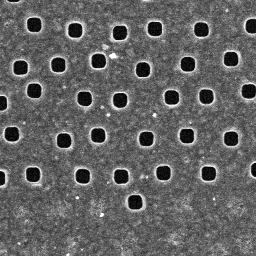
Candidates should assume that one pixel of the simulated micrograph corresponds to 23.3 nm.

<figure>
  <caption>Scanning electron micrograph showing a regular array of holes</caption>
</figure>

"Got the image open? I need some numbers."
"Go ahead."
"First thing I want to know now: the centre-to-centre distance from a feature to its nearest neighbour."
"0.841 µm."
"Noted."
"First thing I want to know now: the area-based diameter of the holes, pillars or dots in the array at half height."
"364 nm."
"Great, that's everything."